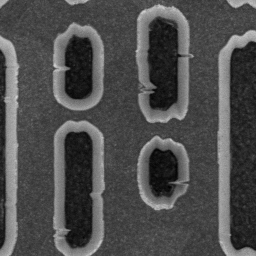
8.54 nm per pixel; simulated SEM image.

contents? one or a few lines or trenches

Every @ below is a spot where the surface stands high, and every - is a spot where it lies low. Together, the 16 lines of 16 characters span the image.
@@@@@@@@@@@@@@@@
@@@@@@@@@--@@@@@
@@@@--@@@---@@@-
-@@@--@@@---@@--
-@@@--@@@---@@--
-@@@--@@@---@@--
-@@@-@@@@--@@@--
-@@@@@@@@@@@@@--
-@@@--@@@@@@@@--
-@@@--@@@--@@@--
-@@@--@@@---@@--
-@@@--@@@--@@@--
-@@@--@@@@-@@@--
-@@@--@@@@@@@@--
-@@@--@@@@@@@@--
@@@@--@@@@@@@@--